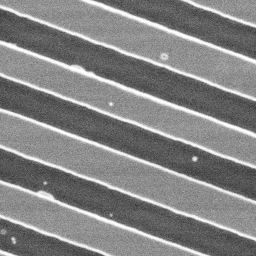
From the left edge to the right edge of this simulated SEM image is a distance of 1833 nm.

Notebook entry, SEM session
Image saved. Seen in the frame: lines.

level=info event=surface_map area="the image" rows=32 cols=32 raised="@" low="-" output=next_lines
@@@@@@@@@@@@@-----------@@@@@@@@
--@@@@@@@@@@@@@------------@@@@@
----@@@@@@@@@@@@@@-----------@@@
-------@@@@@@@@@@@@@@-----------
----------@@@@@@@@@@@@@---------
@-----------@@@@@@@@@@@@@@------
@@@@-----------@@@@@@@@@@@@@@---
@@@@@@@-----------@@@@@@@@@@@@@@
@@@@@@@@@------------@@@@@@@@@@@
@@@@@@@@@@@@-----------@@@@@@@@@
---@@@@@@@@@@@@-----------@@@@@@
------@@@@@@@@@@@------------@@@
--------@@@@@@@@@@@@------------
-----------@@@@@@@@@@@@---------
@@@-----------@@@@@@@@@@@@------
@@@@@@-----------@@@@@@@@@@@@---
@@@@@@@@-----------@@@@@@@@@@@@-
@@@@@@@@@@@-----------@@@@@@@@@@
@@@@@@@@@@@@@@-----------@@@@@@@
---@@@@@@@@@@@@@-----------@@@@@
------@@@@@@@@@@@@@-----------@@
--------@@@@@@@@@@@@@@----------
-----------@@@@@@@@@@@@@@-------
@@@-----------@@@@@@@@@@@@@-----
@@@@@------------@@@@@@@@@@@@@--
@@@@@@@@-----------@@@@@@@@@@@@@
@@@@@@@@@@@-----------@@@@@@@@@@
-@@@@@@@@@@@@@-----------@@@@@@@
----@@@@@@@@@@@@------------@@@@
------@@@@@@@@@@@@@-----------@@
---------@@@@@@@@@@@@@----------
------------@@@@@@@@@@@@@-------